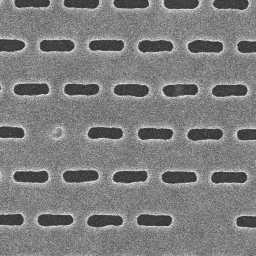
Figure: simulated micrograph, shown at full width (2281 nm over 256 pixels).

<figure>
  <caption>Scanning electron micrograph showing a regular array of holes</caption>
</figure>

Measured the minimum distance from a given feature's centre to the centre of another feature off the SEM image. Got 438 nm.